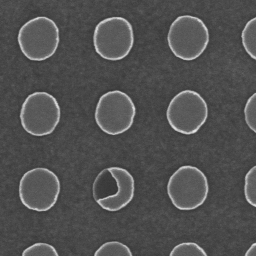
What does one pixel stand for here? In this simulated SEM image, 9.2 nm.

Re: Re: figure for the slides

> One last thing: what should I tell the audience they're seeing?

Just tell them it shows a regular array of raised bodies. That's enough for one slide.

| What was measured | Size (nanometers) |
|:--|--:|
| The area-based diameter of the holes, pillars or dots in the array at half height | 383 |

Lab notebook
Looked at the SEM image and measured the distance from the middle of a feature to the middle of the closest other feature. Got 0.684 microns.